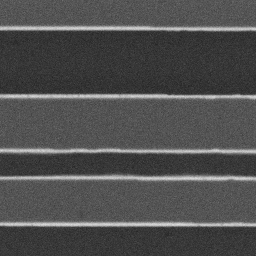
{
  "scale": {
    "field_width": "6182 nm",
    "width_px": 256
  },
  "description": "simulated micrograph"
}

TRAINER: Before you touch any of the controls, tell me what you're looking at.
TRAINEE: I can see lines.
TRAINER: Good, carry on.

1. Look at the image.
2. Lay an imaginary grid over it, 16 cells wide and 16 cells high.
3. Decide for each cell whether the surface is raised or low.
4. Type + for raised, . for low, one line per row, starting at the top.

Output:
++++++++++++++++
++++++++++++++++
................
................
................
................
++++++++++++++++
++++++++++++++++
++++++++++++++++
++++++++++++++++
++++++++++++++++
++++++++++++++++
++++++++++++++++
++++++++++++++++
................
................